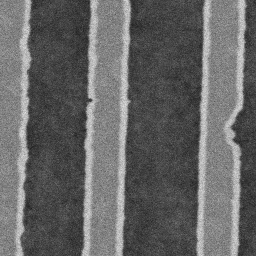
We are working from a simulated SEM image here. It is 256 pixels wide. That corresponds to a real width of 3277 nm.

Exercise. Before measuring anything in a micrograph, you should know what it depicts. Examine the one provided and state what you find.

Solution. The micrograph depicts one or a few lines or trenches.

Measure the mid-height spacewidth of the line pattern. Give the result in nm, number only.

954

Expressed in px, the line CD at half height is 33.8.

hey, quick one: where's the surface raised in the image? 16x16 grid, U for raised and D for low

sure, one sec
UUDDDDUUDDDDDUUD
UUDDDDUUDDDDDUUD
UUDDDDUUDDDDDUUD
UUDDDDUUDDDDDUUD
UUDDDDUUDDDDDUUD
UUDDDDUUDDDDDUUD
UUDDDDUUDDDDDUUD
UUDDDDUUDDDDDUDD
UDDDDDUUDDDDDUDD
UDDDDDUUDDDDDUUD
UDDDDDUUDDDDDUUD
UDDDDDUUDDDDDUUD
UDDDDDUUDDDDDUUD
UDDDDUUUDDDDDUUD
UDDDDUUDDDDDDUUD
UDDDDUUDDDDDDUUD